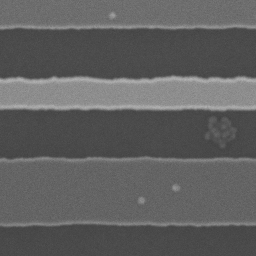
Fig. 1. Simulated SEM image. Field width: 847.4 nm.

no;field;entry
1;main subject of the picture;lines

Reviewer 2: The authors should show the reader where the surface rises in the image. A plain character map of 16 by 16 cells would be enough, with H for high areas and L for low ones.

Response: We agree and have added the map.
HHHHHHHHHHHHHHHH
HHHHHHHHHHHHHHHH
LLLLLLLLLLLLLLLL
LLLLLLLLLLLLLLLL
LLLLLLLLLLLLLLLL
HHHHHHHHHHHHHHHH
HHHHHHHHHHHHHHHH
LLLLLLLLLLLLLLLL
LLLLLLLLLLLLLLLL
LLLLLLLLLLLLLLLL
HHHHHHHHHHHHHHHH
HHHHHHHHHHHHHHHH
HHHHHHHHHHHHHHHH
HHHHHHHHHHHHHHHH
LLLLLLLLLLLLLLLL
LLLLLLLLLLLLLLLL